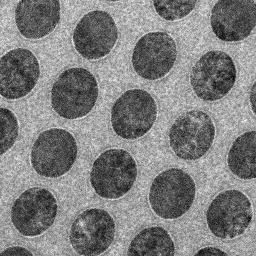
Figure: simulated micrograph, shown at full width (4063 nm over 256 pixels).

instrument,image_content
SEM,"a regular array of holes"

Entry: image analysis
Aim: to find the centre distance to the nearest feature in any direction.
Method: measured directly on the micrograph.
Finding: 61.9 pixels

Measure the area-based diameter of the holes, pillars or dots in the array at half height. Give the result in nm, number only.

776